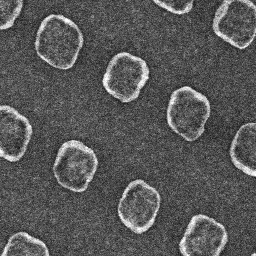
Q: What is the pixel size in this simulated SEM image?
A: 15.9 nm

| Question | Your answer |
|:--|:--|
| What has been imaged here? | raised bodies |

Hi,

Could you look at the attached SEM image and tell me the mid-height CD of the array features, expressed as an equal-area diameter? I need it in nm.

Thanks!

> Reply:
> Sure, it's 708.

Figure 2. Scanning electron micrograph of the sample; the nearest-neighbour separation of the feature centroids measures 1190 nanometres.